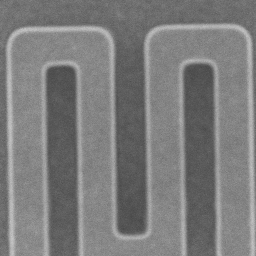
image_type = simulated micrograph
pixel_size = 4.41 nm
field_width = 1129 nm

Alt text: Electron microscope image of groups of lines, slits or small figures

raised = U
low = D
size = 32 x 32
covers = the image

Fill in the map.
DDDDDDDDDDDDDDDDDDDDDDDDDDDDDDDD
DDDDDDDDDDDDDDDDDDDDDDDDDDDDDDDD
DDDDDDDDDDDDDDDDDDDDDDDDDDDDDDDD
DDDDDDDDDDUUDDDDDDDDUUUUUUUUUUDD
DDUUUUUUUUUUUUDDDDDUUUUUUUUUUUUD
DUUUUUUUUUUUUUDDDDUUUUUUUUUUUUUD
DUUUUUUUUUUUUUDDDDUUUUUUUUUUUUUD
DUUUUUUUUUUUUUDDDDUUUUUUUUUUUUUD
DUUUUUDDDUUUUUDDDDUUUUUDDDDUUUUD
DUUUUUDDDDUUUUDDDDUUUUUDDDDUUUUD
DUUUUUDDDDUUUUDDDDUUUUUDDDDUUUUD
DUUUUUDDDDUUUUDDDDUUUUUDDDDUUUUD
DUUUUUDDDDUUUUDDDDUUUUUDDDDUUUUD
DUUUUUDDDDUUUUDDDDUUUUUDDDDUUUUD
DUUUUUDDDDUUUUDDDDUUUUUDDDDUUUUD
DUUUUUDDDDUUUUDDDDUUUUUDDDDUUUUD
DUUUUUDDDDUUUUDDDDUUUUUDDDDUUUUD
DUUUUUDDDDUUUUDDDDUUUUUDDDDUUUUD
DUUUUUDDDDUUUUDDDDUUUUUDDDDUUUUD
DUUUUUDDDDUUUUDDDDUUUUUDDDDUUUUU
DUUUUUDDDDUUUUDDDDUUUUUDDDDUUUUU
DUUUUUDDDDUUUUDDDDUUUUUDDDDUUUUU
DUUUUUDDDDUUUUDDDDUUUUUDDDDUUUUU
DUUUUUDDDDUUUUDDDDDUUUUDDDDUUUUU
DUUUUUDDDDUUUUDDDDDUUUUDDDDUUUUU
DUUUUUDDDDUUUUDDDDDUUUUDDDDUUUUU
DUUUUUDDDDUUUUDDDDDUUUUDDDDUUUUU
DUUUUUDDDDUUUUDDDDDUUUUDDDDUUUUU
DUUUUUDDDDUUUUUDDDUUUUUDDDDUUUUU
DUUUUUDDDDUUUUUUDUUUUUUDDDDUUUUU
DUUUUUDDDDUUUUUUUUUUUUUDDDDUUUUU
DUUUUUDDDDUUUUUUUUUUUUUDDDDUUUUU